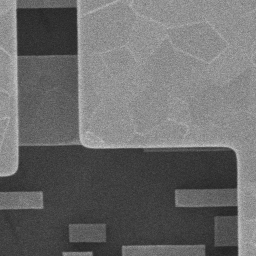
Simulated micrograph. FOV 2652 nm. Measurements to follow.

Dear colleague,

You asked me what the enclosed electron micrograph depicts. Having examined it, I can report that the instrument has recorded wiring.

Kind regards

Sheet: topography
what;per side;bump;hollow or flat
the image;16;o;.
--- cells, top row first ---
o....ooooooooooo
o....ooooooooooo
o....ooooooooooo
o....ooooooooooo
o....ooooooooooo
o....ooooooooooo
o....ooooooooooo
o....ooooooooooo
o....ooooooooooo
o..............o
o..............o
...............o
...............o
...............o
...............o
...............o